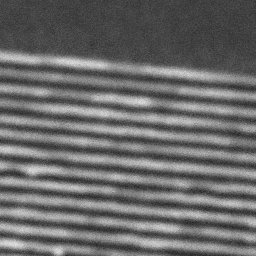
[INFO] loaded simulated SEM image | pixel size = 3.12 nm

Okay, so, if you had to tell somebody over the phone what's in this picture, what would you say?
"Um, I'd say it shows parallel lines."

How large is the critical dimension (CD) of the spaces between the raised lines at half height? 0.0272 µm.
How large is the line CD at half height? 21.8 nm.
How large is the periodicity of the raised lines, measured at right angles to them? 48.3 nm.